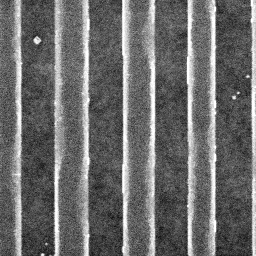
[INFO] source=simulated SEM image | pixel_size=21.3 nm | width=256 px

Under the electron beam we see lines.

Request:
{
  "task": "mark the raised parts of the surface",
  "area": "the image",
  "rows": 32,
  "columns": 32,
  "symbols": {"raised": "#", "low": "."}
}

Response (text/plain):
##.....####.....###.....###.....
##.....####.....###.....###.....
##.....####.....###.....###.....
##.....####.....###.....###.....
##.....####.....###.....###.....
##.....####.....###.....###.....
##.....####.....###.....###.....
##.....####.....###.....###.....
##.....####.....###.....###.....
##.....####.....###.....###.....
##.....####.....###.....###.....
##.....####.....###.....###.....
##.....####.....###.....###.....
##.....####.....###.....###.....
##.....####.....###.....###.....
##.....####.....###.....###.....
##.....####.....###.....###.....
##.....####.....###.....###.....
##.....####.....###.....###.....
##.....####.....###.....###.....
##.....####.....###.....###.....
##.....####.....###.....###.....
##.....####.....###.....###.....
##.....####.....###.....###.....
##.....####.....###.....###.....
##.....####.....###.....###.....
##.....####.....###.....###.....
##.....####.....###.....###.....
##.....####.....###.....###.....
##.....####.....###.....###.....
##.....####.....###.....###.....
##.....####.....###.....###.....